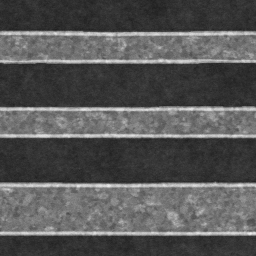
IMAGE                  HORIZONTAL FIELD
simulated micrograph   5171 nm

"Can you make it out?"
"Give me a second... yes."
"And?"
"one or a few lines or trenches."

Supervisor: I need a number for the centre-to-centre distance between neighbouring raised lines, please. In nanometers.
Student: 1630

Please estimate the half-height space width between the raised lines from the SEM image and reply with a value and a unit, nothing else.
995 nanometres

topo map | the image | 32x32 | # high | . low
................................
................................
................................
................................
################################
################################
################################
################################
................................
................................
................................
................................
................................
................................
################################
################################
################################
................................
................................
................................
................................
................................
................................
################################
################################
################################
################################
################################
################################
................................
................................
................................